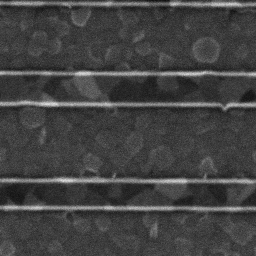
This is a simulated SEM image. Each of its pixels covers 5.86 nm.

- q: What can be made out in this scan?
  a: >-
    one or a few lines or trenches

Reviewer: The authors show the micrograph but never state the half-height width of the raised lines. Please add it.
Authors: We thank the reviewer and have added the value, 171 nanometers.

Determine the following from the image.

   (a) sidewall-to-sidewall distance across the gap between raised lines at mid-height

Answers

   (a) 0.424 microns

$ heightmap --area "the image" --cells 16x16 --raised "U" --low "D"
DDDDDDDDDDDDDDDD
DDDDDDDDDDDDDDDD
DDDDDDDDDDDDDDDD
DDDDDDDDDDDDDDDD
DDDDDDDDDDDDDDDD
UUUUUUUUUUUUUUUU
UUUUUUUUUUUUUUUU
DDDDDDDDDDDDDDDD
DDDDDDDDDDDDDDDD
DDDDDDDDDDDDDDDD
DDDDDDDDDDDDDDDD
UUUUUUUUUUUUUUUU
UUUUUUUUUUUUUUUU
DDDDDDDDDDDDDDDD
DDDDDDDDDDDDDDDD
DDDDDDDDDDDDDDDD